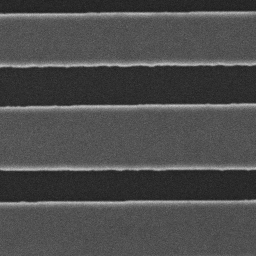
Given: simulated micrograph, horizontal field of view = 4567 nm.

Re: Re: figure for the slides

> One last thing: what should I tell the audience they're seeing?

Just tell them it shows lines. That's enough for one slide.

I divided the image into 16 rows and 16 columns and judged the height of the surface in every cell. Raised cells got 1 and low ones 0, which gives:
0000000000000000
1111111111111111
1111111111111111
1111111111111111
0000000000000000
0000000000000000
0000000000000000
1111111111111111
1111111111111111
1111111111111111
1111111111111111
0000000000000000
0000000000000000
1111111111111111
1111111111111111
1111111111111111